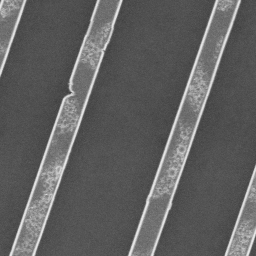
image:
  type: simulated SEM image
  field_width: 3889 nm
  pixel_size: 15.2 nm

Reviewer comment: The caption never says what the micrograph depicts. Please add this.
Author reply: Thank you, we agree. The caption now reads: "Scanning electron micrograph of one or a few lines or trenches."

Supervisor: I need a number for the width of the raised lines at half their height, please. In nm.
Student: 325